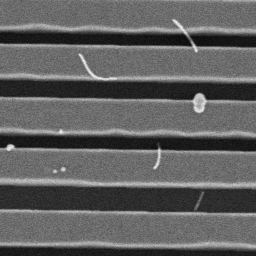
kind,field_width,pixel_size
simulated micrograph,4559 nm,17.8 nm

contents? lines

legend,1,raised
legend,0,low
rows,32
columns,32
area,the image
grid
11111111111111111111111111111111
11111111111111111111111111111111
11111111111111111111111111111111
11111111111111111111111111111111
00000000000000000000000100000000
10000000000000000000000000000000
11111111111111111111111111111111
11111111111111111111111111111111
11111111111111111111111111111111
11111111111111111111111111111111
00000000000000000000000000000000
00000000000000000000000000000000
11111111111111111111110011000000
11111111111111111111111111111111
11111111111111111111111111111111
11111111111111111111111111111111
11111111111111111111111111111111
00000000000000000000000000000000
11000000000000000000000000000000
11111111111111111111111111111111
11111111111111111111111111111111
11111111111111111111111111111111
11111111111111111111111111111111
00000000000000000000000000000000
00000000000000000000000000000000
00000000000000000000000000000000
11111111111111111110000000000000
11111111111111111111111111111111
11111111111111111111111111111111
11111111111111111111111111111111
11111111111111111111111111111111
00000000000000000000000000000000